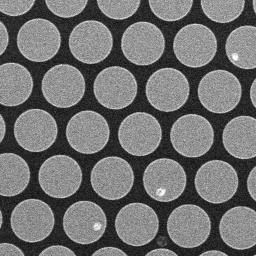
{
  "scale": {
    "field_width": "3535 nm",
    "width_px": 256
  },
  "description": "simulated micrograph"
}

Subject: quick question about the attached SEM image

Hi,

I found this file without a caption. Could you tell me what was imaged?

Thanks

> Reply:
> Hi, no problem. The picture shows an array of small figures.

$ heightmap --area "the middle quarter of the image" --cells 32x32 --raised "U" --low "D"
UUDDDDDDDDDDDDDDDDDDDDDDDDDDDDDU
UUUDDDDDDDUUUUUUDDDDDDDDUUUUDDDD
UUUUDDDDDUUUUUUUUDDDDDUUUUUUUUDD
UUUUUDDDUUUUUUUUUUDDDDUUUUUUUUDD
UUUUUDDDUUUUUUUUUUDDDUUUUUUUUUUD
UUUUUDDDUUUUUUUUUUDDDUUUUUUUUUUD
UUUUUDDDUUUUUUUUUUDDDUUUUUUUUUUD
UUUUUDDDUUUUUUUUUUDDDUUUUUUUUUUD
UUUUDDDDUUUUUUUUUUDDDUUUUUUUUUUD
UUUDDDDDDUUUUUUUUDDDDUUUUUUUUUDD
UUDDDDDDDDUUUUUUDDDDDDUUUUUUUDDD
DDDDDDDDDDDDDDDDDDDDDDDDUUUUDDDD
DDDUUUUUUDDDDDDDDUUUUDDDDDDDDDDD
DDUUUUUUUUDDDDDDUUUUUUUDDDDDDUUU
DUUUUUUUUUUDDDDUUUUUUUUDDDDDUUUU
DUUUUUUUUUUDDDUUUUUUUUUUDDDUUUUU
DUUUUUUUUUUDDDUUUUUUUUUUDDDUUUUU
DUUUUUUUUUUDDDUUUUUUUUUUDDDUUUUU
DUUUUUUUUUUDDDUUUUUUUUUUDDDUUUUU
DUUUUUUUUUUDDDUUUUUUUUUUDDDUUUUU
DDUUUUUUUUDDDDDUUUUUUUUDDDDUUUUU
DDDUUUUUUDDDDDDUUUUUUUUDDDDDUUUU
DDDDDDDDDDDDDDDDDUUUUDDDDDDDDUUU
UUDDDDDDDDUUUUDDDDDDDDDDDDDDDDDD
UUUDDDDDUUUUUUUUDDDDDDUUUUUUDDDD
UUUUDDDDUUUUUUUUDDDDDUUUUUUUUDDD
UUUUDDDUUUUUUUUUUDDDDUUUUUUUUUDD
UUUUDDDUUUUUUUUUUDDDUUUUUUUUUUDD
UUUUDDDUUUUUUUUUUDDDUUUUUUUUUUDD
UUUUDDDUUUUUUUUUUDDDUUUUUUUUUUDD
UUUUDDDUUUUUUUUUUDDDUUUUUUUUUUDD
UUUDDDDDUUUUUUUUDDDDDUUUUUUUUUDD